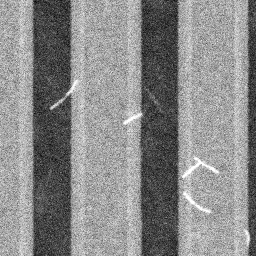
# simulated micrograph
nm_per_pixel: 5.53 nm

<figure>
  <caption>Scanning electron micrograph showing one or a few lines or trenches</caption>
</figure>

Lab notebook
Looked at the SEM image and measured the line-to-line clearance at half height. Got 0.283 um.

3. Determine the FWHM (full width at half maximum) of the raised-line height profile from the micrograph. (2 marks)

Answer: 310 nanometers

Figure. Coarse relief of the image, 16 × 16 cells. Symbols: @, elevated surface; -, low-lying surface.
@@---@@@----@@@-
@@---@@@----@@@-
@@---@@@----@@@-
@@---@@@----@@@-
@@---@@@----@@@-
@@---@@@----@@@-
@@---@@@----@@@-
@@---@@@----@@@-
@@---@@@----@@@-
@@---@@@----@@@-
@@---@@@----@@@-
@@---@@@----@@@-
@@---@@@----@@@-
@@---@@@----@@@-
@@---@@@----@@@-
@@---@@@----@@@-